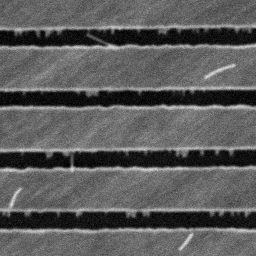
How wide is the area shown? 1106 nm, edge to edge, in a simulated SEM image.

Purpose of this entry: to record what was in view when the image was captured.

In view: lines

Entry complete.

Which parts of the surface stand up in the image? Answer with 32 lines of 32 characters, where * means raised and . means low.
********************************
********************************
********************************
*********************.**........
................................
................................
********************************
********************************
********************************
********************************
********************************
................................
................................
********************************
********************************
********************************
********************************
********************************
********************************
................................
................................
********************************
********************************
********************************
********************************
********************************
................................
................................
................................
********************************
********************************
********************************